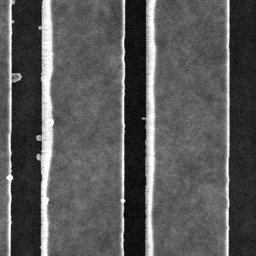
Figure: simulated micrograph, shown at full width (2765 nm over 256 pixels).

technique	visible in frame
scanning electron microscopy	lines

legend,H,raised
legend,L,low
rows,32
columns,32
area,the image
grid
HLLLLLHHHHHHHHHHLLLHHHHHHHHHHLLL
HLLLLLHHHHHHHHHHLLLHHHHHHHHHHLLL
HLLLLLHHHHHHHHHHLLLHHHHHHHHHHLLL
HLLLLLHHHHHHHHHHLLLHHHHHHHHHHLLL
HLLLLLHHHHHHHHHHLLLHHHHHHHHHHLLL
HLLLLLHHHHHHHHHLLLLHHHHHHHHHHLLL
HLLLLLHHHHHHHHHHLLLHHHHHHHHHHLLL
HLLLLLHHHHHHHHHHLLLHHHHHHHHHHLLL
HLLLLLHHHHHHHHHHLLLHHHHHHHHHHLLL
HLLLLLHHHHHHHHHHLLLHHHHHHHHHHLLL
HLLLLLHHHHHHHHHLLLLHHHHHHHHHHLLL
HLLLLLHHHHHHHHHLLLLHHHHHHHHHHLLL
HLLLLLHHHHHHHHHLLLLHHHHHHHHHHLLL
HLLLLLHHHHHHHHHLLLLHHHHHHHHHHLLL
HLLLLLHHHHHHHHHLLLLHHHHHHHHHHLLL
HLLLLLHHHHHHHHHHLLLHHHHHHHHHHLLL
HLLLLLHHHHHHHHHLLLLHHHHHHHHHHLLL
HLLLLLHHHHHHHHHLLLLHHHHHHHHHHLLL
HLLLLLHHHHHHHHHLLLLHHHHHHHHHHLLL
HLLLLLHHHHHHHHHLLLLHHHHHHHHHHLLL
HLLLLLHHHHHHHHHLLLLHHHHHHHHHLLLL
HLLLLHHHHHHHHHHLLLLHHHHHHHHHLLLL
HLLLLHHHHHHHHHHLLLLHHHHHHHHHHLLL
HLLLLHHHHHHHHHHLLLLHHHHHHHHHLLLL
HLLLLHHHHHHHHHHLLLHHHHHHHHHHLLLL
HLLLLHHHHHHHHHHLLLHHHHHHHHHHHLLL
HLLLLHHHHHHHHHHLLLHHHHHHHHHHLLLL
HLLLLHHHHHHHHHHLLLHHHHHHHHHHLLLL
HLLLLHHHHHHHHHHLLLHHHHHHHHHHLLLL
HLLLLHHHHHHHHHHLLLHHHHHHHHHHLLLL
HLLLLHHHHHHHHHHLLLHHHHHHHHHHLLLL
HLLLLHHHHHHHHHHLLLHHHHHHHHHHLLLL